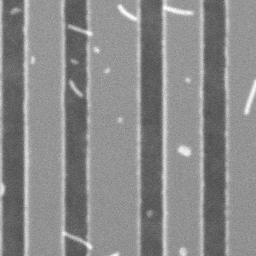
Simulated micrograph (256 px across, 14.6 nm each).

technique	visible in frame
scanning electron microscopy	lines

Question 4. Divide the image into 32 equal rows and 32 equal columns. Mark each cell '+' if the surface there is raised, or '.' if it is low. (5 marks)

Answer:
...+++++...++++++...+++++...++++
...+++++...++++++...+++++...++++
...+++++...++++++...+++++...++++
...+++++...++++++...+++++...++++
...+++++...++++++...+++++...++++
...+++++...++++++...+++++...++++
...+++++...++++++...+++++...++++
...+++++...++++++...+++++...++++
...+++++...++++++...+++++...++++
...+++++...++++++...+++++...++++
...+++++...++++++...+++++...++++
...+++++...++++++...+++++...++++
...+++++...++++++...+++++...++++
...+++++...++++++...+++++...++++
...+++++...++++++...+++++...++++
...+++++...++++++...+++++...++++
...+++++...++++++...+++++...++++
...+++++...++++++...+++++...++++
...+++++...++++++...+++++...++++
...+++++...++++++...+++++...++++
...+++++...++++++...+++++...++++
...+++++...++++++...+++++...++++
...+++++...++++++...+++++...++++
...+++++...++++++...+++++...++++
...+++++...++++++...+++++...++++
...+++++...+++++++..+++++...++++
...+++++...++++++...+++++...++++
...+++++...++++++...+++++...++++
...+++++...++++++...+++++...++++
...+++++...++++++...+++++...++++
...+++++...++++++...+++++...++++
...+++++...++++++...+++++...++++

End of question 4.